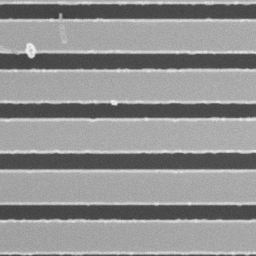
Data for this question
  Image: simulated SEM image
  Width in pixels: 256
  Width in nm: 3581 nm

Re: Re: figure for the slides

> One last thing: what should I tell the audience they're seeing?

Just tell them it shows lines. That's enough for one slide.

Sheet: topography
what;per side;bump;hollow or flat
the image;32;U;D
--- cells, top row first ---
DDDDDDDDDDDDDDDDDDDDDDDDDDDDDDDD
DDDDDDDDDDDDDDDDDDDDDDDDDDDDDDDD
UUUUUUUUUUUUUUUUUUUUUUUUUUUUUUUU
UUUUUUUUUUUUUUUUUUUUUUUUUUUUUUUU
UUUUUUUUUUUUUUUUUUUUUUUUUUUUUUUU
UUUUUUUUUUUUUUUUUUUUUUUUUUUUUUUU
UUUUUUUUUUUUUUUUUUUUUUUUUUUUUUUU
DDDDDDDDDDDDDDDDDDDDDDDDDDDDDDDD
DDDDDDDDDDDDDDDDDDDDDDDDDDDDDDDD
UUUUUUUUUUUUUUUUUUUUUUUUUUUUUUUU
UUUUUUUUUUUUUUUUUUUUUUUUUUUUUUUU
UUUUUUUUUUUUUUUUUUUUUUUUUUUUUUUU
UUUUUUUUUUUUUUUUUUUUUUUUUUUUUUUU
DDDDDDDDDDDDDDDDDDDDDDDDDDDDDDDD
DDDDDDDDDDDDDDDDDDDDDDDDDDDDDDDD
UUUUUUUUUUUUUUUUUUUUUUUUUUUUUUUU
UUUUUUUUUUUUUUUUUUUUUUUUUUUUUUUU
UUUUUUUUUUUUUUUUUUUUUUUUUUUUUUUU
UUUUUUUUUUUUUUUUUUUUUUUUUUUUUUUU
DDDDDDDDDDDDDDDDDDDDDDDDDDDDDDDD
DDDDDDDDDDDDDDDDDDDDDDDDDDDDDDDD
UUUUUUUUUUUUUUUUUUUUUUUUUUUUUUUU
UUUUUUUUUUUUUUUUUUUUUUUUUUUUUUUU
UUUUUUUUUUUUUUUUUUUUUUUUUUUUUUUU
UUUUUUUUUUUUUUUUUUUUUUUUUUUUUUUU
UUUUUUUUUUUUUUUUUUUUUUUUUUUUUUUU
DDDDDDDDDDDDDDDDDDDDDDDDDDDDDDDD
DDDDDDDUDDUDDDDDDDDDDDDDDDDDDDDD
UUUUUUUUUUUUUUUUUUUUUUUUUUUUUUUU
UUUUUUUUUUUUUUUUUUUUUUUUUUUUUUUU
UUUUUUUUUUUUUUUUUUUUUUUUUUUUUUUU
UUUUUUUUUUUUUUUUUUUUUUUUUUUUUUUU